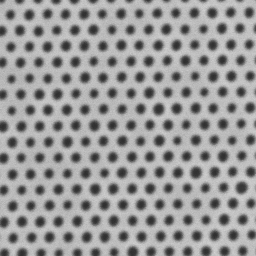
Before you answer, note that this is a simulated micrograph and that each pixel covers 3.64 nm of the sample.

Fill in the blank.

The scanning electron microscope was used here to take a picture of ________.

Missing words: a regular array of holes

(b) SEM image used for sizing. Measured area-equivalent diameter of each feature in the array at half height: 37.4 nm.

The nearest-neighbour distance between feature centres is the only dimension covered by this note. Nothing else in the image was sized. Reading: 65.2 nanometres